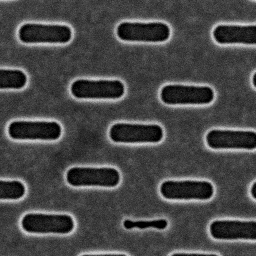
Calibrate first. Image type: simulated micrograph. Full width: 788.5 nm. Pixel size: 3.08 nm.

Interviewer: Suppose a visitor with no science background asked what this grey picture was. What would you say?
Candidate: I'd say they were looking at a regular array of holes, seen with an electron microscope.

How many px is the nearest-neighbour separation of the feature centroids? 65.7